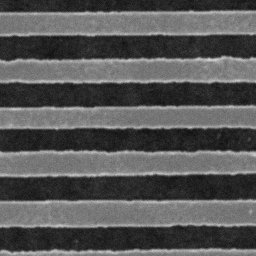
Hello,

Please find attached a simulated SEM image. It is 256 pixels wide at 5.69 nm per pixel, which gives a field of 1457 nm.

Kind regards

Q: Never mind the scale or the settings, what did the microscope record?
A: lines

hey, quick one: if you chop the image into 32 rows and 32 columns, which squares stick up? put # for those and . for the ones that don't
................................
.......................#.....#.#
################################
################################
................................
................................
................................
..............#.##########.#####
################################
################################
................................
................................
................................
.....#...#..####################
################################
################################
................................
................................
................................
################################
################################
################################
................................
................................
................................
################################
################################
################################
................................
................................
................................
#....###########################